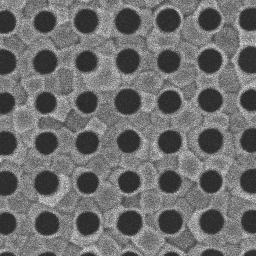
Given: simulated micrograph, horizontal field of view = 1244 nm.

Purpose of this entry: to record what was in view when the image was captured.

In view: a regular array of holes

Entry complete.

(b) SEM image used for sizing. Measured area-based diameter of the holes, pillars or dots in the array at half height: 115 nm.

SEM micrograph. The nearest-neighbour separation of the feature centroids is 195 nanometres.